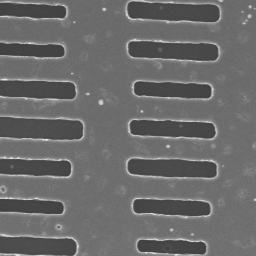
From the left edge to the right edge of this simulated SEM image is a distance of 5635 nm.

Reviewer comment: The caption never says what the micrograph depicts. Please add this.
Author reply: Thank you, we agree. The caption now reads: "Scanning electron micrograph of holes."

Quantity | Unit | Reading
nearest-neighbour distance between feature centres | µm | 0.859